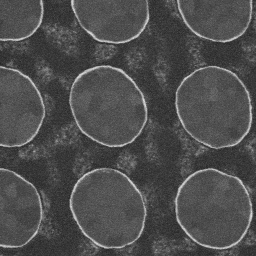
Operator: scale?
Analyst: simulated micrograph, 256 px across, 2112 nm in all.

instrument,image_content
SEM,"raised bodies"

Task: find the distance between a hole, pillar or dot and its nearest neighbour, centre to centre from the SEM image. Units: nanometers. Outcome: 840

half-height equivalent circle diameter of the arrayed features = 638 nanometers